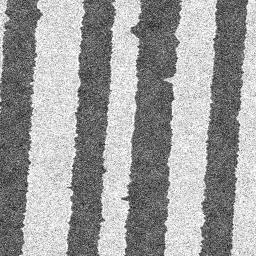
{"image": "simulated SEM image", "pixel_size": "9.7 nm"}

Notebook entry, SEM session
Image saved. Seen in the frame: one or a few lines or trenches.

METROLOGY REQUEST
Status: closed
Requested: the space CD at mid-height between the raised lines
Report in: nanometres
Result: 316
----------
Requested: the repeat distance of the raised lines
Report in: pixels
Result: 68.2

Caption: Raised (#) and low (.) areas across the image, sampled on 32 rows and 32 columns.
#....#####....####.....####....#
#....######....##......####....#
#....#####....###......####....#
#.##.#####....##......#####....#
....######....###.....#####....#
.....#####....###.....#####....#
.....#####....###.....#####....#
....######....###.....#####...##
....######....###.....#####...##
....######....###.....####....##
....######....###....#####....##
....######....###.....####....##
....######....###.....####....##
....######....###.....####....##
....#####....####.....####....##
....#####....####....#####....##
....######...####.....####....##
....#####....###.....#####....##
....#####....###.....#####....##
....#####....###.....#####....##
....#####....###.....#####....##
....#####....###.....#####...###
....#####....###.....#####....##
...######....###.....#####....##
...######....###.....####....###
...######....###.....####....###
...######....###..#..####....###
...######....###.....#####...###
...######....###.....####....###
...#####.....###.....####....###
...#####....####.....####....###
...#####....####.....####....###